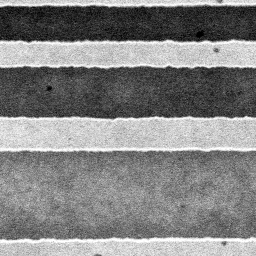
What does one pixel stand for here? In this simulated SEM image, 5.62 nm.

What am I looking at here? lines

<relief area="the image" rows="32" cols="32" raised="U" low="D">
UUUUUUUUUUUUUUUUUUUUUUUUUUUUUUUU
DDDDDDDDDDDDDDDDDDDDDDDDDDDDDDDD
DDDDDDDDDDDDDDDDDDDDDDDDDDDDDDDD
DDDDDDDDDDDDDDDDDDDDDDDDDDDDDDDD
DDDDDDDDDDDDDDDDDDDDDDDDDDDDDDDD
UUUUUUUUUUUUUUUUUUUUUUUUUUUUUUUU
UUUUUUUUUUUUUUUUUUUUUUUUUUUUUUUU
UUUUUUUUUUUUUUUUUUUUUUUUUUUUUUUU
DDDDDDDDDDDDDDDDDDDDDDDDDDDDDDDD
DDDDDDDDDDDDDDDDDDDDDDDDDDDDDDDD
DDDDDDDDDDDDDDDDDDDDDDDDDDDDDDDD
DDDDDDDDDDDDDDDDDDDDDDDDDDDDDDDD
DDDDDDDDDDDDDDDDDDDDDDDDDDDDDDDD
DDDDDDDDDDDDDDDDDDDDDDDDDDDDDDDD
DDDDDDDDDDDDDDDDDDDDDDDDDDDDDDDD
UUUUUUUUUUUUUUUUUUUUUUUUUUUUUUUU
UUUUUUUUUUUUUUUUUUUUUUUUUUUUUUUU
UUUUUUUUUUUUUUUUUUUUUUUUUUUUUUUU
UUUUUUUUUUUUUUUUUUUUUUUUUUUUUUUU
DDDDDDDDDDDDDDDDDDDDDDDDDDDDDDDD
DDDDDDDDDDDDDDDDDDDDDDDDDDDDDDDD
DDDDDDDDDDDDDDDDDDDDDDDDDDDDDDDD
DDDDDDDDDDDDDDDDDDDDDDDDDDDDDDDD
DDDDDDDDDDDDDDDDDDDDDDDDDDDDDDDD
DDDDDDDDDDDDDDDDDDDDDDDDDDDDDDDD
DDDDDDDDDDDDDDDDDDDDDDDDDDDDDDDD
DDDDDDDDDDDDDDDDDDDDDDDDDDDDDDDD
DDDDDDDDDDDDDDDDDDDDDDDDDDDDDDDD
DDDDDDDDDDDDDDDDDDDDDDDDDDDDDDDD
DDDDDDDDDDDDDDDDDDDDDDDDDDDDDDDD
UUUUUUUUUUUUUUUUUUUUUUUUUUUUUUUU
UUUUUUUUUUUUUUUUUUUUUUUUUUUUUUUU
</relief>